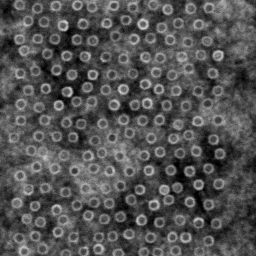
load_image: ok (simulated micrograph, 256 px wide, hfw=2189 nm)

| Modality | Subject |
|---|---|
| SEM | a regular array of raised bodies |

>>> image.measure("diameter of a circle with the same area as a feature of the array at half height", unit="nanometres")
81.8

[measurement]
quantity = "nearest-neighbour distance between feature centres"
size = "0.135 um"